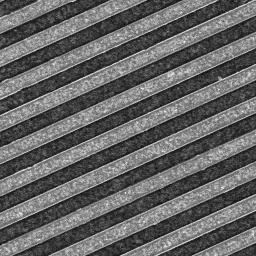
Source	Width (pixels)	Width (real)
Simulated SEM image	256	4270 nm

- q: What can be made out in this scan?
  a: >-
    parallel lines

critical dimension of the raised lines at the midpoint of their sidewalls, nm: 234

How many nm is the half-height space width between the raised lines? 250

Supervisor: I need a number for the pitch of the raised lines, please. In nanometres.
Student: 493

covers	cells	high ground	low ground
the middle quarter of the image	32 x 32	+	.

++..........++++++++.........+++
..........++++++++.........+++++
.......+++++++++.........+++++++
.....++++++++..........+++++++++
...++++++++.........+++++++++...
+++++++++.........+++++++++.....
+++++++.........+++++++++.......
+++++.........+++++++++.........
++..........+++++++++........+++
.........+++++++++..........++++
.......+++++++++.........+++++++
.....+++++++++.........++++++++.
...+++++++++.........++++++++...
.+++++++++.........++++++++.....
+++++++..........++++++++.......
+++++.........+++++++++.........
+++.........++++++++..........++
+.........++++++++..........++++
........++++++++.........+++++++
......++++++++.........+++++++++
...+++++++++.........+++++++++..
.++++++++..........+++++++++....
+++++++..........++++++++.......
+++++.........+++++++++.........
+++.........+++++++++.........++
+.........+++++++++.........++++
........+++++++++.........++++++
......++++++++..........++++++++
...+++++++++.........+++++++++..
.+++++++++.........+++++++++....
++++++++.........++++++++.......
++++++.........++++++++.........